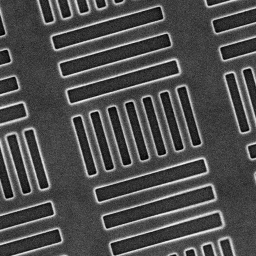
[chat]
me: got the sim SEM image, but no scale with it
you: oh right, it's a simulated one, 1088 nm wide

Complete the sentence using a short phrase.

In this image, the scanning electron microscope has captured groups of lines, slits or small figures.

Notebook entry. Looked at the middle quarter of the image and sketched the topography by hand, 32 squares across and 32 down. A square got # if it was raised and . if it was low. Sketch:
.........#############.......###
......############...........###
...############..............###
############.............#######
########.............###########
####.............###############
#.............##############...#
#.........##############..##...#
#......#############..##...##..#
#..#############.###..##...##...
###############...##..###..##...
###########..###..##...##..###..
#######..##...##..###..##...##..
###.###..##...##..###..###..##..
##...##..###..##...##..###..##..
###..##...##..###..##...##...##.
###..###..##...##..###..##...##.
###..###..###..##...##..###..##.
###...##..###..##...##...##..###
####..##...##...##..###..##...##
####..###..##...##..###..##...##
####...##..###..##...##..###.###
#####..##...##..###..##..#######
#####..###..##...##..###########
#####...##..###..###############
#####...##..################....
######..###.############........
######..#############...........
#################..............#
##############.............#####
##########.............#########
########............############